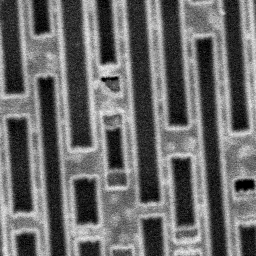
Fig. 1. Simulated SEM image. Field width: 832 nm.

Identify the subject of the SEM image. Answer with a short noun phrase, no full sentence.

parallel lines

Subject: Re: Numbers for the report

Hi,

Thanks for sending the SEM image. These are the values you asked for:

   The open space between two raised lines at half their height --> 71.6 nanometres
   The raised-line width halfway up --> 11.1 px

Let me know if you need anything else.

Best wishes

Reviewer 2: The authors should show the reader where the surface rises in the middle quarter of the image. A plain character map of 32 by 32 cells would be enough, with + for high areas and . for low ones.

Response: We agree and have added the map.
......+++.++++++......+++.....++
......++++++++++......+++......+
......++++++++++......+++......+
......+++.+..+++......+++.....++
......++++++++++......+++......+
......++++++++++......+++......+
.......++++++++++......++......+
.......++++++++++......++......+
.......++++++++++......++......+
.......++++++++++......++......+
.......++++++++++......++......+
.......++++++++++......++......+
+......++++++++++......+++.....+
+......++++++++++......+++.....+
+......++++++++++......+++.....+
+......++++++++++......+++.....+
+......+++.....++......+++++++++
+......+++.....++......+++++++++
+......+++.....++......+++++++++
+.......++.....+++.....+++++++++
+.......++.....+++......++++++++
+++++.++++.....+++......++++++++
++++++++++.....+++......++++++++
++++++++++.....+++......+++.....
++++++++++.....+++......++......
+++++++++++....+++......+++.....
+++++++++++....+++......+++.....
++++++++++++++++++......+++.....
+++.....++++++++++......+++.....
++......++++++++++......+++.....
++......++++++++++......+++.....
++......++++++++++......+++.....